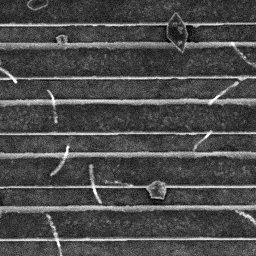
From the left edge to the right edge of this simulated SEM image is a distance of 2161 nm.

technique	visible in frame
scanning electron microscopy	lines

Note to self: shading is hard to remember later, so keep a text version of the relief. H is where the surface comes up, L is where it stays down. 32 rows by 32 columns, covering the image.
HHHHHHHHHHHHHHHHHHHHHHHHHHHHHHHH
HHHHHHHHHHHHHHHHHHHHHHHHHHHHHHHH
HHHHHHHHHHHHHHHHHHHHHHHHHHHHHHHH
LLLLLLLLLLLLLLLLLLLLLHHLLLLLLLLL
LLLLLLLLLLLLLLLLLLLLLHHLLLLLLLLL
LLLLLLLHHLLLLLLLLLLLLHHHLLLLHHLL
HHHHHHHHHHHHHHHHHHHHHHHHHHHHHHHH
HHHHHHHHHHHHHHHHHHHHHHHHHHHHHHHH
HHHHHHHHHHHHHHHHHHHHHHHHHHHHHHHH
HHHHHHHHHHHHHHHHHHHHHHHHHHHHHHHH
LLLLLLLLLLLLLLLLLLLLLLLLLLLLLLLL
LLLLLLLLLLLLLLLLLLLLLLLLLLLLLLLL
LLLLLLLLLLLLLLLLLLLLLLLLLLLLLLLL
HHHHHHHHHHHHHHHHHHHHHHHHHHHHHHHH
HHHHHHHHHHHHHHHHHHHHHHHHHHHHHHHH
HHHHHHHHHHHHHHHHHHHHHHHHHHHHHHHH
HHHHHHHHHHHHHHHHHHHHHHHHHHHHHHHH
LLLLLLLLLLLLLLLLLLLLLLLLLLLLLLLL
LLLLLLLLLLLLLLLLLLLLLLLLLLLLLLLL
HHHHHHHHHHHHHHHHHHHHHHHHHHHHHHHH
HHHHHHHHHHHHHHHHHHHHHHHHHHHHHHHH
HHHHHHHHHHHHHHHHHHHHHHHHHHHHHHHH
HHHHHHHHHHHHHHHHHHHHHHHHHHHHHHHH
LLLLLLLLLLLHLLLLLLHHHLLLLLLLLLLL
LLLLLLLLLLLLLLLLLLLHLLLLLLLLLLLL
LLLLLLLLLLLLLLLLLLLLLLLLLLLLLLLL
HHHHHHHHHHHHHHHHHHHHHHHHHHHHHHHH
HHHHHHHHHHHHHHHHHHHHHHHHHHHHHHHH
HHHHHHHHHHHHHHHHHHHHHHHHHHHHHHHH
HHHHHHHHHHHHHHHHHHHHHHHHHHHHHHHH
LLLLLLLLLLLLLLLLLLLLLLLLLLLLLLLL
LLLLLLLLLLLLLLLLLLLLLLLLLLLLLLLL